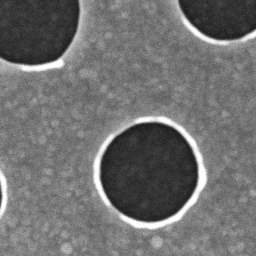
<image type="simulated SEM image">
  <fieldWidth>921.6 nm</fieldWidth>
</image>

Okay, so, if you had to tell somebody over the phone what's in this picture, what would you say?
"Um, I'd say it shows holes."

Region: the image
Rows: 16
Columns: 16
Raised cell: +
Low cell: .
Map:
.....++++++.....
.....+++++++....
.....+++++++++.+
....++++++++++++
++++++++++++++++
++++++++++++++++
++++++++++++++++
++++++++++++++++
+++++++....+++++
+++++++.....++++
++++++......++++
++++++......++++
+++++++.....++++
++++++++...+++++
++++++++++++++++
++++++++++++++++